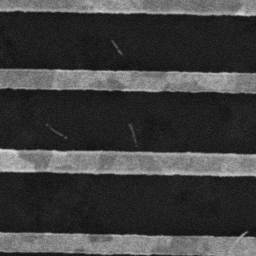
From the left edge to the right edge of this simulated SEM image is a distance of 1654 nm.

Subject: lines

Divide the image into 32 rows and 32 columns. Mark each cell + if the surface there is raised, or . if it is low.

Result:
++++++++++++++++++++++++++++++++
..................++++++++++++++
................................
................................
................................
................................
................................
................................
................................
++++++++++++++++++++++++++++++++
++++++++++++++++++++++++++++++++
........................+..+++++
................................
................................
................................
................................
................................
................................
................................
++++++++++++++++++++++++++++++++
++++++++++++++++++++++++++++++++
...........+++++++++++++++++++++
................................
................................
................................
................................
................................
................................
................................
++++++++++++++++++..............
++++++++++++++++++++++++++++++++
........++++++++++++++++++++++++